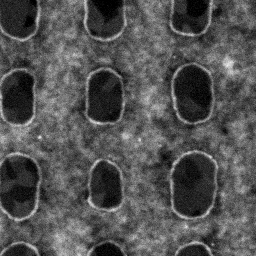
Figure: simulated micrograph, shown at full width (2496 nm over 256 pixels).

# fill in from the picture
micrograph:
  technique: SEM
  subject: raised bodies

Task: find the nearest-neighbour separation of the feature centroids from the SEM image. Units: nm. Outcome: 859